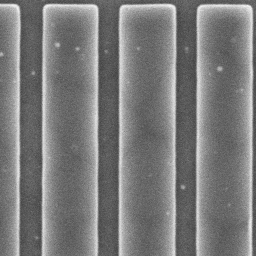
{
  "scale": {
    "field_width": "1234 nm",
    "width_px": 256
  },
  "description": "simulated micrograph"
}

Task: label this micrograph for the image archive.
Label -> wiring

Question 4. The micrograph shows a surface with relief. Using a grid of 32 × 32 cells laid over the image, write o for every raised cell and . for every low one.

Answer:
................................
oo...ooooooo...ooooooo...oooooo.
oo...ooooooo...ooooooo...oooooo.
oo...ooooooo...ooooooo...oooooo.
oo...ooooooo...ooooooo...oooooo.
oo...ooooooo...ooooooo...oooooo.
oo...ooooooo...ooooooo...oooooo.
oo...ooooooo...ooooooo...oooooo.
oo...ooooooo...ooooooo...oooooo.
oo...ooooooo...ooooooo...oooooo.
oo...ooooooo...ooooooo...oooooo.
oo...ooooooo...ooooooo...oooooo.
oo...ooooooo...ooooooo...oooooo.
oo...ooooooo...ooooooo...oooooo.
oo...ooooooo...ooooooo...oooooo.
oo...ooooooo...ooooooo...oooooo.
oo...ooooooo...ooooooo...oooooo.
oo...ooooooo...ooooooo...oooooo.
oo...ooooooo...ooooooo...oooooo.
oo...ooooooo...ooooooo...oooooo.
oo...ooooooo...ooooooo...oooooo.
oo...ooooooo...ooooooo...oooooo.
oo...ooooooo...ooooooo...oooooo.
oo...ooooooo...ooooooo...oooooo.
oo...ooooooo...ooooooo...oooooo.
oo...ooooooo...ooooooo...oooooo.
oo...ooooooo...ooooooo...oooooo.
oo...ooooooo...ooooooo...oooooo.
oo...ooooooo...ooooooo...oooooo.
oo...ooooooo...ooooooo...oooooo.
oo...ooooooo...ooooooo...oooooo.
oo...ooooooo...ooooooo...oooooo.